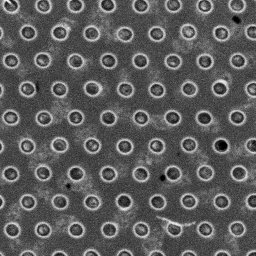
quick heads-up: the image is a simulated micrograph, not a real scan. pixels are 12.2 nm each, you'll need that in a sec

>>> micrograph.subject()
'a regular array of holes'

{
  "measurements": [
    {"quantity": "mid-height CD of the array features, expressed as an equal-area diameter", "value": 161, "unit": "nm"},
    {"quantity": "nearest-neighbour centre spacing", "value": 384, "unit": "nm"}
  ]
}